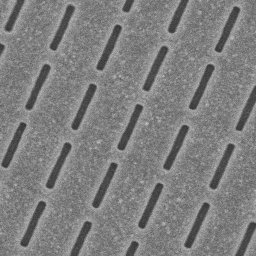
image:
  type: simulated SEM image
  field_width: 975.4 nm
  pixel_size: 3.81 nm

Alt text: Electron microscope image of a regular array of holes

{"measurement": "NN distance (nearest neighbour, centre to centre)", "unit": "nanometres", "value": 191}